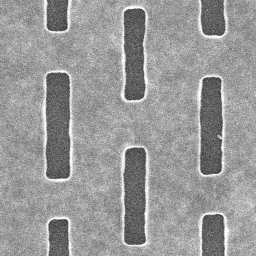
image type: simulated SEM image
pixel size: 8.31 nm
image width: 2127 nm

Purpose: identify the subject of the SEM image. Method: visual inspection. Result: holes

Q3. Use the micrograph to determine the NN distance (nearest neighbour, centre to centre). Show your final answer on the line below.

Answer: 862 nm